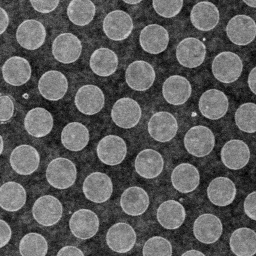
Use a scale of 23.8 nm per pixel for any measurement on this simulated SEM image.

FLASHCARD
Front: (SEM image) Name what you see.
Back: a regular array of raised bodies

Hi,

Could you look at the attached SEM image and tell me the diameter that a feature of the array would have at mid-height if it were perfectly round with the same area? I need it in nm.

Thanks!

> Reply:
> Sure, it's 676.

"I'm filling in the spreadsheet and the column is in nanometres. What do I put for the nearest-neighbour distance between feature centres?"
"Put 925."